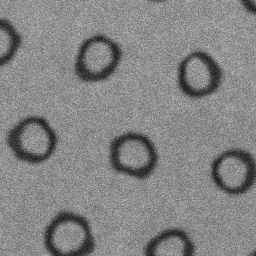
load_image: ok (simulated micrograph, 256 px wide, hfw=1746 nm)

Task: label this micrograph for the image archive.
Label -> ring-shaped grooves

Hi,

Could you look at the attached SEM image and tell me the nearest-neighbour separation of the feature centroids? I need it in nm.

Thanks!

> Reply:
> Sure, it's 700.